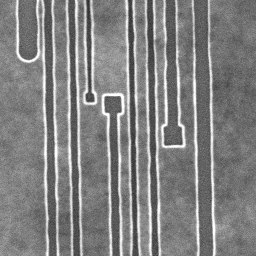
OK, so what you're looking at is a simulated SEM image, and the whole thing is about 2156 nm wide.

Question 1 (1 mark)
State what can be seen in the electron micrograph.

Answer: groups of lines, slits or small figures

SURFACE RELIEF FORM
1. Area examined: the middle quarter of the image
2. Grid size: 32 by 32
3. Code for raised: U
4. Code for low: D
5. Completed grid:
UDDUUUDUUUUUUUUUDDUUUDDUUDDDUUUU
UDDUUUDUUUUUUUUUDDUUUDDUUDDDDUUU
UDDUUUDUUUUUUUUUDDUUUDDUUDDDDUUU
UDDUUUDUUUUUUUUUDDUUUDDUUDDDDUUU
UDDUUUDUUUUUUUUUDDUUUDDUUDDDDUUU
UDDUUUDUUUUUUUUUDDUUUDDUUDDDDUUU
UDDDUUDUUUUUUUUUDDUUUDDUUDDDDUUU
UDDDUDDDUUUUUUUUDDUUUDDUUDDDDUUU
UDDDUDDDUUDDDDDUDDUUUDDUUDDDDUUU
UDDDUDDDUUDDDDDUDDUUUDDUUDDDDUUU
UDDDUUUUUUDDDDDUDDUUUDDUUDDDDUUU
UDDDUUUUUUDDDDDUDDUUUDDUUUDDDUUU
UDDDUUUUUUUDDDUUDDUUUDDUUUDDDUUU
UDDDUUUUUUUDDDUUDDUUUDDUUUDDDUUU
UDDDUUUUUUUDDDUUDDUUUDDUUUDDDUUU
UDDDUUUUUUUDDDUUDDUUUDDUUDDDDUUU
UDDDUUUUUUUDDDUUDDUUUDDUUDDDDDUU
UDDDUUUUUUUDDDUUDDUUUDDUUDDDDDUU
UDDDUUUUUUUDDDUUDDUUUDDUUDDDDDUU
UDDDUUUUUUUDDDUUDDUUUDDUUDDDDDUU
UDDDUUUUUUUDDDUUDDUUUDDUUDDDDUUU
UDDDUUUUUUUDDDUUDDUUUDDUUUUUUUUU
UDDDUUUUUUUDDDUUDDUUUDDUUUUUUUUU
UDDDUUUUUUUDDDUUDDUUUDDUUUUUUUUU
UUDDUUUUUUUDDDUUDDUUUDDUUUUUUUUU
UUDDUUUUUUUDDDUUDDUUUDDUUUUUUUUU
UUDDUUUUUUUDDDUUDDUUUDDUUUUUUUUU
UUDDUUUUUUUUDDUUDDUUUDDUUUUUUUUU
UUDDUUUUUUUUDDUUDDUUUDDDUUUUUUUU
UUDDUUUUUUUUDDUUDDUUUDDDUUUUUUUU
UUDDUUUUUUUUDDUUDDUUUDDDUUUUUUUU
UUDDUUUUUUUUDDUUUDUUUDDDUUUUUUUU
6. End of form